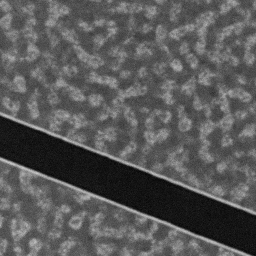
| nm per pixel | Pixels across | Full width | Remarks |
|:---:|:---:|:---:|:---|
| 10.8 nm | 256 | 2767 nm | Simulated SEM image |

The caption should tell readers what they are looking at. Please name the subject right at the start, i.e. one or a few lines or trenches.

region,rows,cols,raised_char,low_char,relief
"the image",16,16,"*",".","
****************
****************
****************
****************
****************
****************
****************
.***************
....************
......**********
*........*******
****.......*****
*******.......**
*********.......
************....
**************..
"